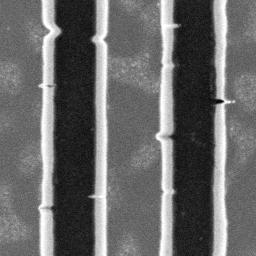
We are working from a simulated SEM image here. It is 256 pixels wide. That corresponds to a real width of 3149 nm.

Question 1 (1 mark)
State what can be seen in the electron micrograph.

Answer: one or a few lines or trenches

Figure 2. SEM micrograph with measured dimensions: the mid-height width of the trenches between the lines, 656 nm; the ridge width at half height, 807 nm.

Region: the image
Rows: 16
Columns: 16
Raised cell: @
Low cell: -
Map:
@@@---@@@@----@@
@@@---@@@@@---@@
@@@---@@@@@---@@
@@@---@@@@@---@@
@@@---@@@@----@@
@@@---@@@@----@@
@@@---@@@@----@@
@@@---@@@@----@@
@@@---@@@@----@@
@@@---@@@@----@@
@@@---@@@@----@@
@@@---@@@@----@@
@@@---@@@@----@@
@@@---@@@@----@@
@@@---@@@@----@@
@@@---@@@@----@@